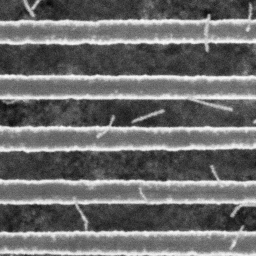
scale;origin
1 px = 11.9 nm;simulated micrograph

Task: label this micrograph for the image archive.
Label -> lines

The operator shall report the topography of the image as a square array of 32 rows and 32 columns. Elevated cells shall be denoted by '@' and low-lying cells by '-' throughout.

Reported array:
--------------------------------
--------------------------------
-------------------------@@----@
@@@@@@@@@@@@@@@@@@@@@@@@@@@@@@@@
@@@@@@@@@@@@@@@@@@@@@@@@@@@@@@@@
--------------------------------
--------------------------------
--------------------------------
--------------------------------
-@------------------------------
@@@@@@@@@@@@@@@@@@@@@@@@@@@@@@@@
@@@@@@@@@@@@@@@@@@@@@@@@@@@@@@@@
--------------------------------
--------------------------------
--------------------------------
--------------------------------
@@@@@@@@@@@@@@@@@@@@@@@@@@@@@@@@
@@@@@@@@@@@@@@@@@@@@@@@@@@@@@@@@
@@@@@@@@@@@@@@@@@@@@@@@@@@@@@---
--------------------------------
--------------------------------
--------------------------------
--------------------------------
@@@@@@@@@@@@@@@@@@@@@@@@@@@@@@@@
@@@@@@@@@@@@@@@@@@@@@@@@@@@@@@@@
------------------------------@@
--------------------------------
--------------------------------
--------------------------------
@@@@@@@@@@@@@@@@@@@@@@@@@@@@@@@@
@@@@@@@@@@@@@@@@@@@@@@@@@@@@@@@@
@@@@@@@@@@@@@@@@@@@@@@@@@@@@@@@@